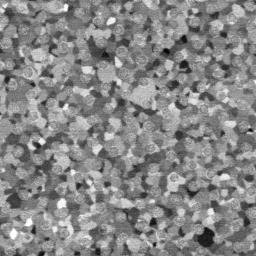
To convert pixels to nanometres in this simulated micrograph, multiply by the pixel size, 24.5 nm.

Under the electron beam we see a regular array of holes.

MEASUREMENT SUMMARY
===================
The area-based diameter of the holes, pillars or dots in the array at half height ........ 242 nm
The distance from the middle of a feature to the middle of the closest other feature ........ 0.521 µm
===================